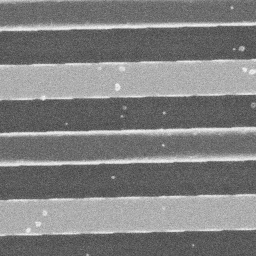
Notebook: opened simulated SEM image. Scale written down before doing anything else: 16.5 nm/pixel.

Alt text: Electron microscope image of lines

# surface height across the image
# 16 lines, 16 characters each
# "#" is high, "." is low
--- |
################
################
................
................
################
################
................
................
################
################
................
................
...#############
################
#######.........
................